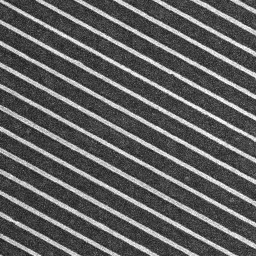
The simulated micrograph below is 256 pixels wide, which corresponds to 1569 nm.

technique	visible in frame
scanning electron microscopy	parallel lines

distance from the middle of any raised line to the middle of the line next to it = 115 nanometers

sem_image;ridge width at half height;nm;21.5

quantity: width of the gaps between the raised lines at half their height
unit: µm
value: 0.0936